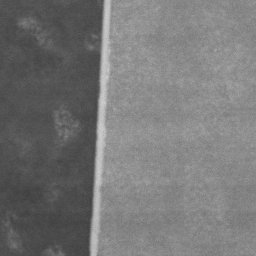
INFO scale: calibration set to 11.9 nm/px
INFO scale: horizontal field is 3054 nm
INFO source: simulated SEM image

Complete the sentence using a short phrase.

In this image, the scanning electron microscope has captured one or a few lines or trenches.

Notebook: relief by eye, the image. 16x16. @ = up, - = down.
-------@@@@@@@@@
-------@@@@@@@@@
-------@@@@@@@@@
-------@@@@@@@@@
------@@@@@@@@@@
------@@@@@@@@@@
------@@@@@@@@@@
------@@@@@@@@@@
------@@@@@@@@@@
------@@@@@@@@@@
------@@@@@@@@@@
------@@@@@@@@@@
------@@@@@@@@@@
------@@@@@@@@@@
------@@@@@@@@@@
------@@@@@@@@@@